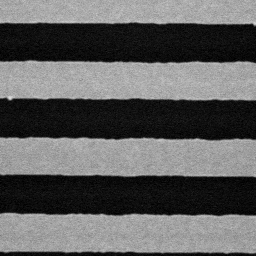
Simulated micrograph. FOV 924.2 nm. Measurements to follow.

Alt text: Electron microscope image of lines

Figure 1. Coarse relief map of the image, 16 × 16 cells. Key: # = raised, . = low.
################
................
................
................
################
################
................
................
................
################
################
................
................
################
################
################